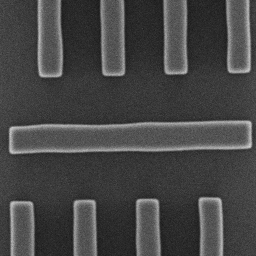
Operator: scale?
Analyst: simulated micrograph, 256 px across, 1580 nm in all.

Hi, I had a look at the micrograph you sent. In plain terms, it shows groups of lines, slits or small figures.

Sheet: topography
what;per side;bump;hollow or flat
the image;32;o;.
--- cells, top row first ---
.....ooo.....oo.....ooo.....ooo.
.....ooo.....oo......oo.....ooo.
.....ooo.....oo......oo.....ooo.
.....ooo.....oo......oo.....ooo.
.....ooo.....oo......oo......oo.
.....ooo.....oo......oo......oo.
.....ooo.....oo......oo......oo.
.....ooo.....ooo.....oo......oo.
.....ooo.....ooo.....oo......oo.
.....oo.........................
................................
................................
................................
................................
................................
.................oooooooooooooo.
.oooooooooooooooooooooooooooooo.
.oooooooooooooooooooooooooooooo.
.oooooooooooooooooooooooooooooo.
................................
................................
................................
................................
................................
................................
..oo.....ooo.....ooo.....ooo....
.ooo.....ooo.....ooo.....ooo....
.ooo.....ooo.....ooo.....ooo....
.ooo.....ooo.....ooo.....ooo....
.ooo.....ooo.....ooo.....ooo....
.ooo.....ooo.....ooo.....ooo....
.ooo.....ooo.....ooo.....ooo....